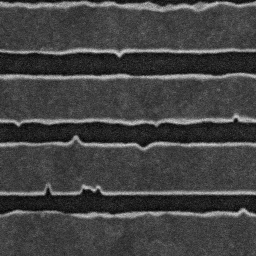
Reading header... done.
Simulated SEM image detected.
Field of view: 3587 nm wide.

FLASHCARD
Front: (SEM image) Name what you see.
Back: one or a few lines or trenches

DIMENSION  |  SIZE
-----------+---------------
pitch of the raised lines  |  980 nm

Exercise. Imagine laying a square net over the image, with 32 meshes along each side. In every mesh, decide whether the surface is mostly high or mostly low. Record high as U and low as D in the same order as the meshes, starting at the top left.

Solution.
DDDDDDDDDDUDDDDDDDDDDDDDDDDUUDDU
UUUUUUUUUUUUUUUUUUUUUUUUUUUUUUUU
UUUUUUUUUUUUUUUUUUUUUUUUUUUUUUUU
UUUUUUUUUUUUUUUUUUUUUUUUUUUUUUUU
UUUUUUUUUUUUUUUUUUUUUUUUUUUUUUUU
UUUUUUUUUUUUUUUUUUUUUUUUUUUUUUUU
DUUUDUUUUDDDDDUDDDDDDDDDDDDDDDDD
DDDDDDDDDDDDDDDDDDDDDDDDDDDDDDDD
DDDDDDDDDDDDDDDDDDDDDDDDDDDDDDDD
DDDDDDDDDDDDDDDDDDDDDDDDUDDDUUUD
UUUUUUUUUUUUUUUUUUUUUUUUUUUUUUUU
UUUUUUUUUUUUUUUUUUUUUUUUUUUUUUUU
UUUUUUUUUUUUUUUUUUUUUUUUUUUUUUUU
UUUUUUUUUUUUUUUUUUUUUUUUUUUUUUUU
UUUUUUUUUUUUUUUUUUUUUUUUUUUUUUUU
DDDDDDDDDDDDDDDDDDDDDDDDDDDDDDDD
DDDDDDDDDDDDDDDDDDDDDDDDDDDDDDDD
DDDDDDDDDUDDDDDDDDDDDDDDDDDDDDDD
UUUUUUUUUUUUUUUUUUUUUUUUUUUUUUUU
UUUUUUUUUUUUUUUUUUUUUUUUUUUUUUUU
UUUUUUUUUUUUUUUUUUUUUUUUUUUUUUUU
UUUUUUUUUUUUUUUUUUUUUUUUUUUUUUUU
UUUUUUUUUUUUUUUUUUUUUUUUUUUUUUUU
UUUUUUUUUUUUUUUUUUUUUUUUUUUUUUUU
DDDDDDDDDDDDDDDDDDDDDDDDDDDDDDDD
DDDDDDDDDDDDDDDDDDDDDDDDDDDDDDDD
DDUUUUUDDDDDDDDDDDDDDDDDDDDDDDUD
UUUUUUUUUUUUUUUUUUUUUUUUUUUUUUUU
UUUUUUUUUUUUUUUUUUUUUUUUUUUUUUUU
UUUUUUUUUUUUUUUUUUUUUUUUUUUUUUUU
UUUUUUUUUUUUUUUUUUUUUUUUUUUUUUUU
UUUUUUUUUUUUUUUUUUUUUUUUUUUUUUUU